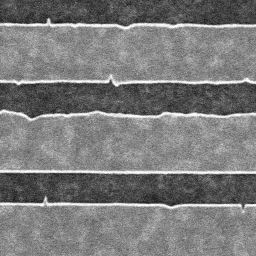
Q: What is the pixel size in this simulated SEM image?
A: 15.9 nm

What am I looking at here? one or a few lines or trenches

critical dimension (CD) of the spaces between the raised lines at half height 514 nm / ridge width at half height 57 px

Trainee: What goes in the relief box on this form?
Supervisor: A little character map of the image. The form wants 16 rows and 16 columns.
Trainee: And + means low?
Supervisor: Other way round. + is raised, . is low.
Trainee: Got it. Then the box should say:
................
................
++++++++++++++++
++++++++++++++++
++++++++++++++++
................
................
++++++++++++++++
++++++++++++++++
++++++++++++++++
++++++++++++++++
................
................
++++++++++++++++
++++++++++++++++
++++++++++++++++